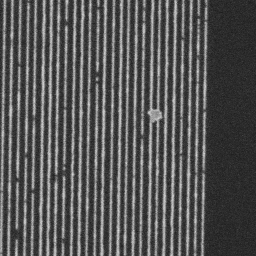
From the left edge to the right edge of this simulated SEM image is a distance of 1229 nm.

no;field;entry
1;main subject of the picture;parallel lines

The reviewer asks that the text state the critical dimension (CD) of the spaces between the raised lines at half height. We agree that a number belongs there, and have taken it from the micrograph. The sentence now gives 28.2 nm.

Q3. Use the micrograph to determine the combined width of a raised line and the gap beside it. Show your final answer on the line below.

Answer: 37.2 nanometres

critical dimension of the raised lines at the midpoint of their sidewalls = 0.0072 microns